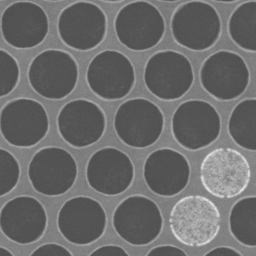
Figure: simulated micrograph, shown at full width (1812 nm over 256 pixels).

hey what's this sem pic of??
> a regular array of holes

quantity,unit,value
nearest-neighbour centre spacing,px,56.2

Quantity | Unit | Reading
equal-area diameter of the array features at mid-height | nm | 340